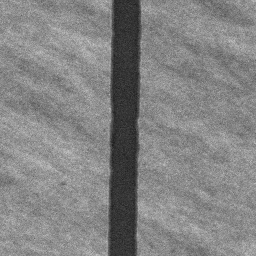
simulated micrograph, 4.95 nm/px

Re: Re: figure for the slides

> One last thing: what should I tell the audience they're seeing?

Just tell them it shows one or a few lines or trenches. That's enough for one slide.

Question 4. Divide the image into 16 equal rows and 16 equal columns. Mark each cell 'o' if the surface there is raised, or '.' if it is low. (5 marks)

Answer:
ooooooo..ooooooo
ooooooo..ooooooo
ooooooo..ooooooo
ooooooo..ooooooo
ooooooo..ooooooo
ooooooo..ooooooo
ooooooo..ooooooo
ooooooo..ooooooo
ooooooo..ooooooo
ooooooo..ooooooo
ooooooo..ooooooo
ooooooo..ooooooo
ooooooo..ooooooo
ooooooo..ooooooo
ooooooo..ooooooo
ooooooo..ooooooo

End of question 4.